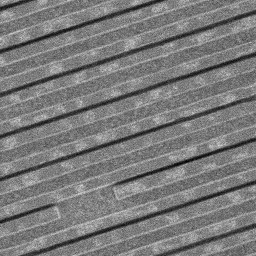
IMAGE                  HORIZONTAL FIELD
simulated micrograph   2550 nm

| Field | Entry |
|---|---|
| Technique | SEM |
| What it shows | parallel lines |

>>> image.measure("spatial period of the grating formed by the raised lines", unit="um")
0.202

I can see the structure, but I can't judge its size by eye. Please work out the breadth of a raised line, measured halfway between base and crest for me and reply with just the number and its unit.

0.11 microns